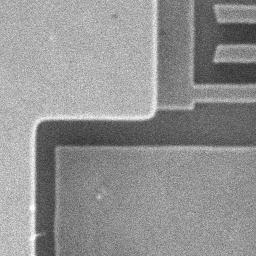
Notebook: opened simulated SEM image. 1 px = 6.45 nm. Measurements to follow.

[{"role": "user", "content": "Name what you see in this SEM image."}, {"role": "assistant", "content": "wiring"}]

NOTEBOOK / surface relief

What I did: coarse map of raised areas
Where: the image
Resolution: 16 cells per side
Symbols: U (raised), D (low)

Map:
UUUUUUUUUUDDDDDD
UUUUUUUUUUDDDDDD
UUUUUUUUUUDDDDDD
UUUUUUUUUUDDDDDD
UUUUUUUUUUDDDDDD
UUUUUUUUUUDDDDDD
UUUUUUUUUUDDDDDD
UUUDDDDDDDDDDDDD
UUDDDDDDDDDDDDDD
UUDDDDDDDDDDDDDD
UUDDDDDDDDDDDDDD
UUDDDDDDDDDDDDDD
UUDDDDDDDDDDDDDD
UUDDDDDDDDDDDDDD
UUDDDDDDDDDDDDDD
UUDDDDDDDDDDDDDD